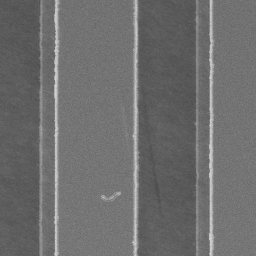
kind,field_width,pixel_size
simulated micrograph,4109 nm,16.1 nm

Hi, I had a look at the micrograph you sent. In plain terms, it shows lines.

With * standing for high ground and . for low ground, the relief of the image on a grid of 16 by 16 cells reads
...******...****
...******...****
...******...****
...******...****
...******...****
...******...****
...******...****
...******...****
...******...****
...******...****
...******...****
...******...****
...******...****
...******...****
...*****....****
...******...****